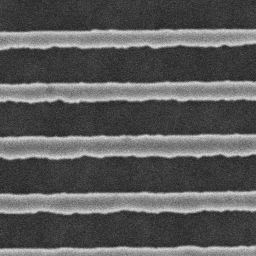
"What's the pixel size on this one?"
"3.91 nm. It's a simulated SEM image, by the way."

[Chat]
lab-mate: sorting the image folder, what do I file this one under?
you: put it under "lines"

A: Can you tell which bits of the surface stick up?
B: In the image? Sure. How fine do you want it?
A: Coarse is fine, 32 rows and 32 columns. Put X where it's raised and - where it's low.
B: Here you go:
--------------------------------
--------------------------------
--------------------------------
--------------------------------
XXXXXXXXXXXXXXXXXXXXXXXXXXXXXXXX
XXXXXXXXXXXXXXXXXXXXXXXXXXXXXXXX
--------------------------------
--------------------------------
--------------------------------
--------------------------------
---XXXXXXXXXXXXXXXXXXXXXXXXXXXXX
XXXXXXXXXXXXXXXXXXXXXXXXXXXXXXXX
XXXXXXX-XXXXXX--XX----XX--------
--------------------------------
--------------------------------
--------------------------------
--------------------------------
XXXXXXXXXXXXXXXXXXXXXXXXXXXXXXXX
XXXXXXXXXXXXXXXXXXXXXXXXXXXXXXXX
XXXXXXXXXX-XXX-X-XX-XX--XX--X-X-
--------------------------------
--------------------------------
--------------------------------
--------------------------------
XXXXXXXXXXXXXXXXXXXXXXXXXXXXXXXX
XXXXXXXXXXXXXXXXXXXXXXXXXXXXXXXX
XXXXX-XXXXXXXX----XX-XXXX-------
--------------------------------
--------------------------------
--------------------------------
--------------------------------
XXXXXXXXXXXXXXXXXXXXXXXXXXXXXXXX